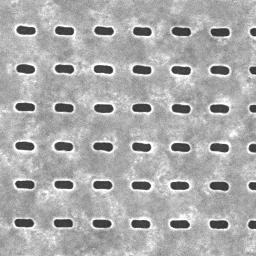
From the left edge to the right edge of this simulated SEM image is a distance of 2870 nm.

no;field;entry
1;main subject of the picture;a regular array of holes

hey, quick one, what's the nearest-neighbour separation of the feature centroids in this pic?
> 429 nm